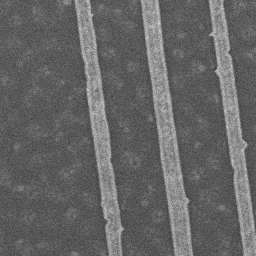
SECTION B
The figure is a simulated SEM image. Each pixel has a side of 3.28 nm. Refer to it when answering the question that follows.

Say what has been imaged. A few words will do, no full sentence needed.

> one or a few lines or trenches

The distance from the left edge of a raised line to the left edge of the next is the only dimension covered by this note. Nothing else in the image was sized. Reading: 218 nanometres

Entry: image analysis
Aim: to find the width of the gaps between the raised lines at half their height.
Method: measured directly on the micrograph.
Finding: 174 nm